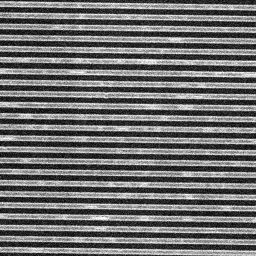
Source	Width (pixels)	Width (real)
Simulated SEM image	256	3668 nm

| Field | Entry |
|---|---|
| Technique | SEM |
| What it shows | parallel lines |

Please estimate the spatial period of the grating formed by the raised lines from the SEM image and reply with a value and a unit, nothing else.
160 nm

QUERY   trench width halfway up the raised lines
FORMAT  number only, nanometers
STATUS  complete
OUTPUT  87.8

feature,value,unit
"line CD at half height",62.7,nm